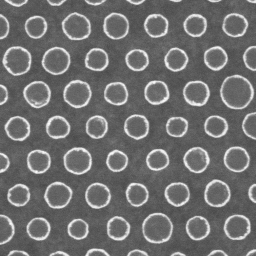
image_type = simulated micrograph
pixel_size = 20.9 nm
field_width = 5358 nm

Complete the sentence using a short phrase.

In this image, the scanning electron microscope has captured a regular array of raised bodies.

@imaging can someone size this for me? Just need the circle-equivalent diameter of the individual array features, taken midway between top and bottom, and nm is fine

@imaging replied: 488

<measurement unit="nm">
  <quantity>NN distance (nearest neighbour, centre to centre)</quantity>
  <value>811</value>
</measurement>